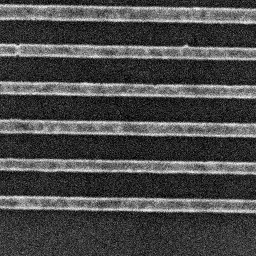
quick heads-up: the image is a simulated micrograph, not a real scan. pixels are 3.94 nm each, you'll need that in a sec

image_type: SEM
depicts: parallel lines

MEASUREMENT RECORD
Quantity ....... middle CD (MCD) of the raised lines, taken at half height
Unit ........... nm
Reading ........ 45.3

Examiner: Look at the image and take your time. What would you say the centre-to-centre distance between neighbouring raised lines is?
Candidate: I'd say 150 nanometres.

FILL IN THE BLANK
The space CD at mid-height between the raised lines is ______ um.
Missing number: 0.105